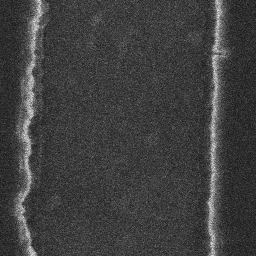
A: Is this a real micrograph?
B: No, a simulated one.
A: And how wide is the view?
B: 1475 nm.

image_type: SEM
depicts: one or a few lines or trenches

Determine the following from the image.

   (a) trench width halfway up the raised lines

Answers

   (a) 1050 nm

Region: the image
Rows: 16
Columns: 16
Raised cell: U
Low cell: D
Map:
UUDDDDDDDDDDDDUU
UUDDDDDDDDDDDDUU
UUDDDDDDDDDDDDUU
UUDDDDDDDDDDDDUU
UUDDDDDDDDDDDUUU
UUDDDDDDDDDDDUUU
UUDDDDDDDDDDDUUU
UUDDDDDDDDDDDUUU
UUDDDDDDDDDDDUUU
UUDDDDDDDDDDDUUU
UUDDDDDDDDDDDUUU
UUDDDDDDDDDDDUUU
UDDDDDDDDDDDDUUU
UDDDDDDDDDDDDUUU
UUDDDDDDDDDDDUUU
UUDDDDDDDDDDDUUU